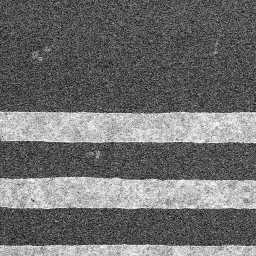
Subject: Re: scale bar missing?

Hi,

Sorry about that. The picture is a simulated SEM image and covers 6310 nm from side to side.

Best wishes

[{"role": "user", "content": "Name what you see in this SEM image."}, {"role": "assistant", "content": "one or a few lines or trenches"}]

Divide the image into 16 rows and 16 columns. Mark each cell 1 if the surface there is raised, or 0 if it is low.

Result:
0000000000000000
0000000000000000
0000000000000000
0000000000000000
0000000000000000
0000000000000000
0000000000000000
1111111111111111
1111111111111111
0000000000000000
0000000000000000
1111111111111111
1111111111111111
0000000000000000
0000000000000000
1111111111111111